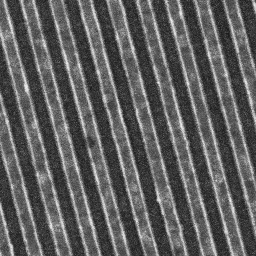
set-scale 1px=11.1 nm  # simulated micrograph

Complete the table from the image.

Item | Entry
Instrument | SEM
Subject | parallel lines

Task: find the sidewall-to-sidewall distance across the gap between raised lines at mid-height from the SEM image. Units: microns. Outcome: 0.183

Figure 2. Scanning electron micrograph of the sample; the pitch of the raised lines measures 312 nm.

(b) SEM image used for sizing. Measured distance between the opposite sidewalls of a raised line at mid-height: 131 nm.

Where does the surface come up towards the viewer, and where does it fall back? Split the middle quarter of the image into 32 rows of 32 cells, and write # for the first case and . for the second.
.###....###....###....####....##
.###....###.....###....###....##
.###.....###....###....###....##
..###....###....###....###.....#
..###....###....####...####....#
..###....###.....###....###....#
..###.....##.....###....###....#
...###....###....###....###.....
...###....###....####....###....
...###....###.....###....###....
....###....###....###....###....
....###....###....###....###....
....###....###....####....###...
....###.....##....####....###...
.....###....###....###....###...
.....###....###....###....###...
#....###....###....###.....###..
#....###....####....###....###..
#.....###....###....###....###..
##....###....###....###....####.
##....###....###....###.....###.
##....###....####....###....###.
##.....###....###....###....###.
###....###....###....###.....##.
###....###....###....###.....###
###....###....####....###....###
###....####....###....###....###
.###....###....###....###.....##
.###....###....###.....###....##
.###....###.....###....###....##
.###.....###....###....###....##
..###....###....###....###.....#